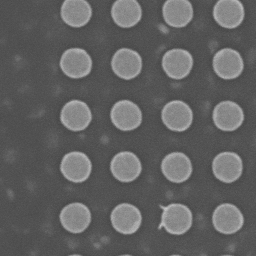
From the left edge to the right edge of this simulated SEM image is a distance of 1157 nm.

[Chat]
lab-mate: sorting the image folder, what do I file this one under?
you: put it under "a regular array of raised bodies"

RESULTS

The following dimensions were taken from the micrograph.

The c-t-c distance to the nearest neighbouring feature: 229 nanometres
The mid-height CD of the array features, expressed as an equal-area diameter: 135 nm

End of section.